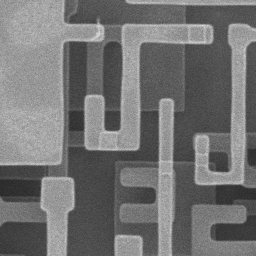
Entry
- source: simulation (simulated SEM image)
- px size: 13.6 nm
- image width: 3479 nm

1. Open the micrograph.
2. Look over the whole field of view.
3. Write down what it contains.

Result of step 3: wiring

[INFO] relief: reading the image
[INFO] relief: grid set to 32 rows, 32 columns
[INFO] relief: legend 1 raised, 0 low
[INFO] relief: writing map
11111111110000000000000111111111
11111111100000000000000000000000
11111111100000000000000000000000
11111111111111111111111111000111
11111111111111111111111111100111
11111111100110011100000000000110
11111111000110011000000000000110
11111111000110011000000000000110
11111111000110011000000000000110
11111111000110011000000000000110
11111111000110011000000000000110
11111111000110011000000000000110
11111111000110011000100000000110
11111111000110011000110000000110
11111111000110011000110000000110
11111111000110011000110000000110
11111111000111111000110000000110
11111111000111111000110011111110
11111111000111111000110011111110
11111111000000000000100001001110
11111111000000000000100001000110
00000011000000011111110001101111
00000111100000011111110011111111
00000111100000000001110000000000
00000111100000000000110000000000
11111111100000000001110000000000
11111111100000011111110011111110
11111111000000011111110011111110
00000011000000000000100011000000
00000011000000011000100011000000
00000011000000111100100011111111
00000011000000111100100011111111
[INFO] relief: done